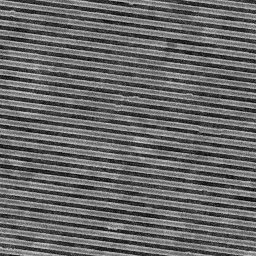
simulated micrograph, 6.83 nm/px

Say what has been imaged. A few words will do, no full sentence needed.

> parallel lines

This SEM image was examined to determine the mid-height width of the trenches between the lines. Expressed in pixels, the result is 4.95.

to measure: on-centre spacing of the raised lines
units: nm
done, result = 67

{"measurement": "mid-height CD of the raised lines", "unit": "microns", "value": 0.033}